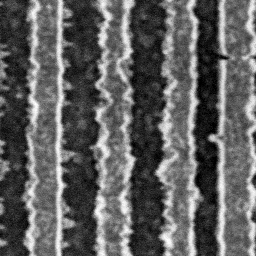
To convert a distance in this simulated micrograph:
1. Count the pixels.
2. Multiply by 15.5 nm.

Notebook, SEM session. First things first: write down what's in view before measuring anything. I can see one or a few lines or trenches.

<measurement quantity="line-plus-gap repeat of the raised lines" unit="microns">0.991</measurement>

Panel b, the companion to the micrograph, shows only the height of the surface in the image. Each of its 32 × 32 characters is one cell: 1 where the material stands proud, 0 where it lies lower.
00000111000001110000011100001111
00001111000001110000011100001110
00001110000001110000011100001110
00001110000001110000001100001110
00001110000001110000011100001111
00001110000001110000011100001111
00001110000001110000011100001111
00001110000001100000011100000110
00000111000001100000011100001111
00001110000001100000011100001111
00001110000011110000001100001111
00001111000001110000011100001110
00001111000000110000011100001111
00000110000001110000011100001110
00001110000011110000011100001110
00001110000001110000011100001111
00001110000001110000011100001110
00001110000001110000011100011110
00001110000001110000011100001110
00001110000001110000001100001111
00001110000001110000011100001111
00001110000001110000111100001111
00000110000001110000011100001110
00001111000001110000001100001110
00001110000011100000011100001111
00001110000001110000011100001111
00001110000011110000011100001110
00001110000011110000011100001110
00001110000011110000001100001111
00001110000001100000011100001111
00001110000001110000011100001111
00001110000001110000011100001110